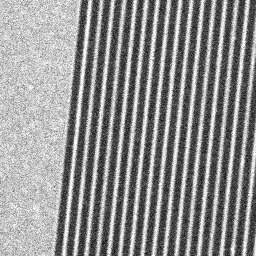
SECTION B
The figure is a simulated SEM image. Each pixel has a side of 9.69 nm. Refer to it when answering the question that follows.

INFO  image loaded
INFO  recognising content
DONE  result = parallel lines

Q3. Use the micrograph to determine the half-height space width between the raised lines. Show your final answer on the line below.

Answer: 0.0759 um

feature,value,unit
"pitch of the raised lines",108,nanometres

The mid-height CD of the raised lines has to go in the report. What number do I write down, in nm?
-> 28.9